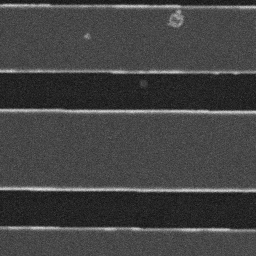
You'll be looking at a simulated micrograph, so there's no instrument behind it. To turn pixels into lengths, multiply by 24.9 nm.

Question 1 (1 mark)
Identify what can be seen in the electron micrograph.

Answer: lines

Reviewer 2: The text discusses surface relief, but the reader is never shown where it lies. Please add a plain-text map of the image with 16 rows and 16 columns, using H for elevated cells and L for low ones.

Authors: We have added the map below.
HHHHHHHHHHHHHHHH
HHHHHHHHHHHHHHHH
HHHHHHHHHHHHHHHH
HHHHHHHHHHHHHHHH
LLLLLLLHHHHHHHHH
LLLLLLLLLLLLLLLL
LLLLLLLLLLLLLLLL
HHHHHHHHHHHHHHHH
HHHHHHHHHHHHHHHH
HHHHHHHHHHHHHHHH
HHHHHHHHHHHHHHHH
HHHHHHHHHHHHHHHH
LLLLLLLLLLLLLLLL
LLLLLLLLLLLLLLLL
HHHHHHHHHHHHHHHH
HHHHHHHHHHHHHHHH